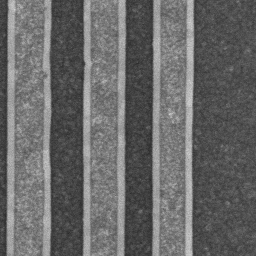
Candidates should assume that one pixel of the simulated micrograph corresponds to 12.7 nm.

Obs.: one or a few lines or trenches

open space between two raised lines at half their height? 459 nanometres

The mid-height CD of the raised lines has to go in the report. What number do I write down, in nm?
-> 448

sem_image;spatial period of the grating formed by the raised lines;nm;915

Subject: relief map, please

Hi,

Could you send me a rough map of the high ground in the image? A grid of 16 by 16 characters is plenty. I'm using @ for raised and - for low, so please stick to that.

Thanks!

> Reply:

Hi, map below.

-@@--@@@--@@----
-@@--@@@--@@----
-@@--@@@--@@----
-@@--@@@--@@----
-@@--@@@--@@----
-@@--@@@--@@----
-@@--@@@--@@----
-@@--@@@--@@----
-@@--@@@--@@----
-@@--@@@--@@----
-@@--@@@--@@----
-@@--@@@--@@----
-@@--@@@--@@----
-@@--@@@--@@----
-@@--@@@--@@----
-@@--@@@--@@----